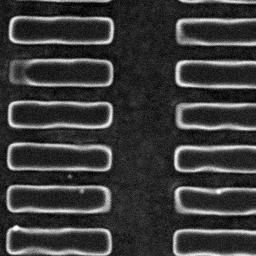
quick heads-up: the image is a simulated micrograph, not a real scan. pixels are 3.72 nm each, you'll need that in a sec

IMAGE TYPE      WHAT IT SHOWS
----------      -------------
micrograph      groups of lines, slits or small figures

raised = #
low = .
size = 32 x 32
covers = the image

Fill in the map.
................................
................................
..############................##
.#############........##########
.#############........##########
.........................#######
................................
.........###....................
..############........##########
..############........##########
....##########.........#########
................................
................................
.#############........##########
.#############........##########
.#############........##########
................................
................................
.############..........##.######
.#############........##########
.#############........##########
.............................###
................................
.############..........#........
.#############........##########
.#############........##########
.........###............########
................................
................................
.#############........##########
.#############........##########
.###.#########........##########